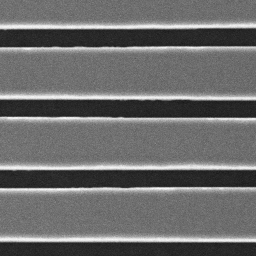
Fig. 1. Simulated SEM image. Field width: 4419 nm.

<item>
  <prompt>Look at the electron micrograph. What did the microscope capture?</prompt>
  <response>lines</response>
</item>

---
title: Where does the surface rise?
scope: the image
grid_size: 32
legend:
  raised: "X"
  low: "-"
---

XXXXXXXXXXXXXXXXXXXXXXXXXXXXXXXX
XXXXXXXXXXXXXXXXXXXXXXXXXXXXXXXX
XXXXXXXXXXXXXXXXXXXXXXXXXXXXXXXX
XXXXXXXXXXX-XXXXX---------------
--------------------------------
--------------------------------
XXXXXXXXXXXXXXXXXXXXXXXXXXXXXXXX
XXXXXXXXXXXXXXXXXXXXXXXXXXXXXXXX
XXXXXXXXXXXXXXXXXXXXXXXXXXXXXXXX
XXXXXXXXXXXXXXXXXXXXXXXXXXXXXXXX
XXXXXXXXXXXXXXXXXXXXXXXXXXXXXXXX
XXXXXXXXXXXXXXXXXXXXXXXXXXXXXXXX
------------------------------XX
--------------------------------
--------------------------------
XXXXXXXXXXXXXXXXXXXXXXXXXXXXXXXX
XXXXXXXXXXXXXXXXXXXXXXXXXXXXXXXX
XXXXXXXXXXXXXXXXXXXXXXXXXXXXXXXX
XXXXXXXXXXXXXXXXXXXXXXXXXXXXXXXX
XXXXXXXXXXXXXXXXXXXXXXXXXXXXXXXX
XXXXXXXXXXXXXXXXXXXXXXXXXXXXXXXX
--------------------------------
--------------------------------
------------XX--XXXXXXXXXXXXXXXX
XXXXXXXXXXXXXXXXXXXXXXXXXXXXXXXX
XXXXXXXXXXXXXXXXXXXXXXXXXXXXXXXX
XXXXXXXXXXXXXXXXXXXXXXXXXXXXXXXX
XXXXXXXXXXXXXXXXXXXXXXXXXXXXXXXX
XXXXXXXXXXXXXXXXXXXXXXXXXXXXXXXX
XXXXXXXXXXXXXXXXXXXXXXXXXXXXXXXX
--------------------------------
--------------------------------